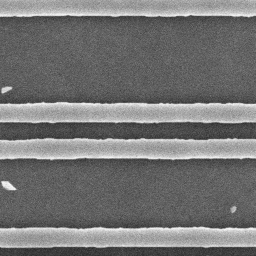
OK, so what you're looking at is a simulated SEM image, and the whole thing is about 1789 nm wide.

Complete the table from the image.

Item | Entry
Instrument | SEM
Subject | lines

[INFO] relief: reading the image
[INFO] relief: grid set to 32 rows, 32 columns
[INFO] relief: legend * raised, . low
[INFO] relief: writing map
********************************
********************************
................................
................................
................................
................................
................................
................................
................................
................................
................................
................................
................................
********************************
********************************
................................
................................
...**********************.******
********************************
********************************
................................
................................
................................
................................
................................
................................
................................
................................
............*...........**......
********************************
********************************
................................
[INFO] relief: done